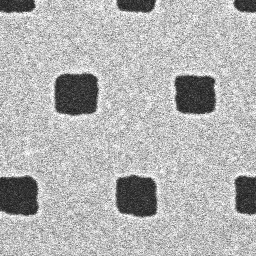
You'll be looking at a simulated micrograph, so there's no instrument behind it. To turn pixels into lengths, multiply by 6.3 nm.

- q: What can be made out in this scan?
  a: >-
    holes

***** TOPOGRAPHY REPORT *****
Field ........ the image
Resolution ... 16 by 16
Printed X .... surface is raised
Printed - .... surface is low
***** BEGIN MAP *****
--XXXXX---XXXXX-
XXXXXXXXXXXXXXXX
XXXXXXXXXXXXXXXX
XXXXXXXXXXXXXXXX
XXXXXXXXXXXXXXXX
XXX---XXXXX--XXX
XXX---XXXXX--XXX
XXXXXXXXXXXXXXXX
XXXXXXXXXXXXXXXX
XXXXXXXXXXXXXXXX
XXXXXXXXXXXXXXXX
--XXXXX---XXXXX-
--XXXXX---XXXXX-
XXXXXXXX-XXXXXXX
XXXXXXXXXXXXXXXX
XXXXXXXXXXXXXXXX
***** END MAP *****